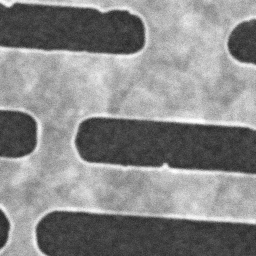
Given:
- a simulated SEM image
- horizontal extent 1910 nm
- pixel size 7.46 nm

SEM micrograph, one or a few lines or trenches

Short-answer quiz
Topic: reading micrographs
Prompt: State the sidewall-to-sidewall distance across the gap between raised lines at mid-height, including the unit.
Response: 0.354 µm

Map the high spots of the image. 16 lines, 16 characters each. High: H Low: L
LLLLLLHHHHHHHHHH
LLLLLLLLLHHHHHHL
LLLLLLLLLHHHHHLL
HHHHHHHHHHHHHHLL
HHHHHHHHHHHHHHHH
HHHHHHHHHHHHHHHH
HHHHHHHHHHHHHHHH
LLHHHLLLLLHHHHHH
LLHHHLLLLLLLLLLL
LLHHHLLLLLLLLLLL
HHHHHHHHHLHLLLLL
HHHHHHHHHHHHHHHH
HHHHHHHHHHHHHHHH
HHHLLLLLLLHHHHHH
LHLLLLLLLLLLLLLL
HHLLLLLLLLLLLLLL